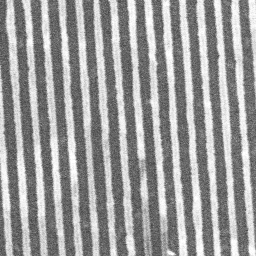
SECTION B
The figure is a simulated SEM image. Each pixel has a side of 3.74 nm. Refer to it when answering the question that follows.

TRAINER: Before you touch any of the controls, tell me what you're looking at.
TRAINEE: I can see parallel lines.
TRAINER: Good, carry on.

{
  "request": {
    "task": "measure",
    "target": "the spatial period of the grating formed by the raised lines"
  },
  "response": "17.3 pixels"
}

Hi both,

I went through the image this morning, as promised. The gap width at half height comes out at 45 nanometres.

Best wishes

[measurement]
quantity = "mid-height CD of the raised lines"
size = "4.87 px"